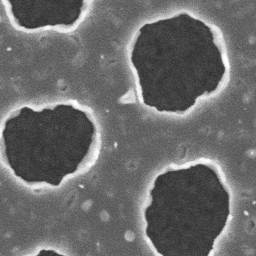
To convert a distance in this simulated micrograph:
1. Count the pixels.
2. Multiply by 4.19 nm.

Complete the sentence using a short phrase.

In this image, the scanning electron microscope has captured holes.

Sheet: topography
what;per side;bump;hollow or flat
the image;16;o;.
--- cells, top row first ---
o....ooooooooooo
o...ooooo....ooo
oooooooo.....ooo
oooooooo......oo
ooooooooo.....oo
ooooooooo....ooo
ooooooooo...oooo
......oooooooooo
......oooooooooo
......oooooooooo
o....ooooooo.ooo
oooooooooo....oo
ooooooooo.....oo
ooooooooo.....oo
ooooooooo.....oo
oooooooooo...ooo